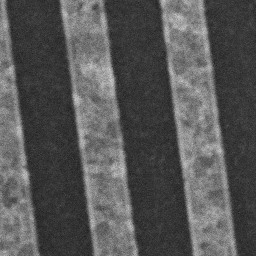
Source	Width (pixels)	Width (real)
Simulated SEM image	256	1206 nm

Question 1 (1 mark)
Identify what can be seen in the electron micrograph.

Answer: one or a few lines or trenches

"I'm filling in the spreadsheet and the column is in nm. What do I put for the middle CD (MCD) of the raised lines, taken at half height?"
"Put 174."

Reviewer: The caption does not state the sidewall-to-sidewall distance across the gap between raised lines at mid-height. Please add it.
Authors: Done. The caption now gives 289 nm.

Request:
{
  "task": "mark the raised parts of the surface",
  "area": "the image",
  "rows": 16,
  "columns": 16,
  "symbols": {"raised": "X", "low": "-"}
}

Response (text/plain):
----XX----XXX---
----XX----XXX---
----XXX---XXX---
X---XXX----XX---
X----XX----XX---
X----XX----XX---
X----XX----XX---
X----XX----XX---
X----XX----XXX--
X----XXX---XXX--
X----XXX----XX--
XX----XX----XX--
XX----XX----XX--
XX----XX----XX--
XX----XX----XX--
XX----XX----XXX-